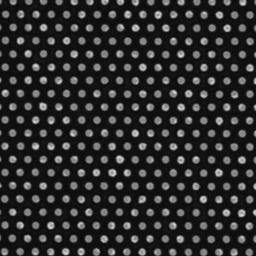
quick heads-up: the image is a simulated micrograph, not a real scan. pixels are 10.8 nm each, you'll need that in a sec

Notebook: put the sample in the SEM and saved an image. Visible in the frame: a regular array of raised bodies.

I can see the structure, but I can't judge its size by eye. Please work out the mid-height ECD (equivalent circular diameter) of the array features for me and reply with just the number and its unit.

77.4 nanometres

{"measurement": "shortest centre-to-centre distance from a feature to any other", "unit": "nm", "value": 160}